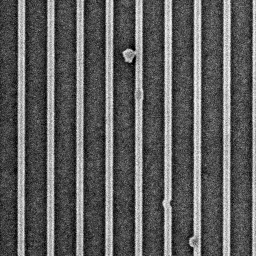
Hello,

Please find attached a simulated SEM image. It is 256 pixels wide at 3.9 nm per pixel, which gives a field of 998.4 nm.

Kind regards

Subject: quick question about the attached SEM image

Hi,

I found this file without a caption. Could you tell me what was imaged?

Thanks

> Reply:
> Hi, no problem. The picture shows parallel lines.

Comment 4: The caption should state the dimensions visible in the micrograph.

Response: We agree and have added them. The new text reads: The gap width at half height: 23.4 pixels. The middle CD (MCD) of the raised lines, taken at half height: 24.4 nanometres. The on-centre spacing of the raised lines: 0.115 micrometres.